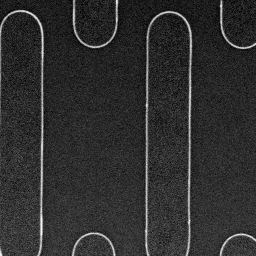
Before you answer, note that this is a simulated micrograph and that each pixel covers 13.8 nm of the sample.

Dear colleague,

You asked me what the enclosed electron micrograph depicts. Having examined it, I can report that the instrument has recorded groups of lines, slits or small figures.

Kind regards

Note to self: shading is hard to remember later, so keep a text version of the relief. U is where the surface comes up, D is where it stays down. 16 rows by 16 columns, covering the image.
DDDDDUUDDDDDDDUU
UUDDDUUDDUUUDDUU
UUUDDUUDDUUUDDUU
UUUDDDDDDUUUDDDD
UUUDDDDDDUUUDDDD
UUUDDDDDDUUUDDDD
UUUDDDDDDUUUDDDD
UUUDDDDDDUUUDDDD
UUUDDDDDDUUUDDDD
UUUDDDDDDUUUDDDD
UUUDDDDDDUUUDDDD
UUUDDDDDDUUUDDDD
UUUDDDDDDUUUDDDD
UUUDDDDDDUUUDDDD
UUUDDDDDDUUUDDDD
UUUDDUUDDUUUDDUU